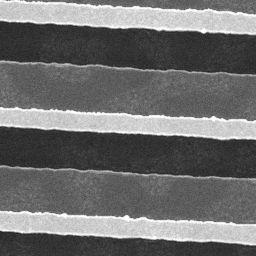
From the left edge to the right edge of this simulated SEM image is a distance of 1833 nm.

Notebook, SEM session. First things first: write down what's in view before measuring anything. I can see lines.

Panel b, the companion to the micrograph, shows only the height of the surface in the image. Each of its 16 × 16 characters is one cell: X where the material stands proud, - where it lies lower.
XXXXXXXXXXXXXXXX
----XXXXXXXXXXXX
----------------
----------------
XXXXXXXXXXXXX---
XXXXXXXXXXXXXXXX
XXXXXXXXXXXXXXXX
XXXXXXXXXXXXXXXX
------------XXXX
----------------
XX--------------
XXXXXXXXXXXXXXXX
XXXXXXXXXXXXXXXX
XXXXXXXXXXXXXXXX
-XXXXXXXXXXXXXXX
----------------